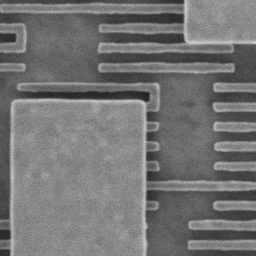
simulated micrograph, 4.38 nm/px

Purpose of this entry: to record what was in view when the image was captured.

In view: wiring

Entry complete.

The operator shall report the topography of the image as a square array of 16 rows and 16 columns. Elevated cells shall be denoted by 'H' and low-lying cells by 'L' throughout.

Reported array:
LLLLLLLLLLLLHHHH
LLLLLLLLLLLLHHHH
LLLLLLLLLLLLHHHH
LLLLLLLLLLLLLLLL
LLLLLLLLLLLLLLLL
LLLLLLLLLLLLLLLL
LHHHHHHHHLLLLLLL
LHHHHHHHHLLLLLLL
LHHHHHHHHLLLLLLL
LHHHHHHHHLLLLLLL
LHHHHHHHHLLLLLLL
LHHHHHHHHLLLLLLL
LHHHHHHHHLLLLLLL
LHHHHHHHHLLLLLLL
LHHHHHHHHLLLLLLL
LHHHHHHHHLLLLLLL